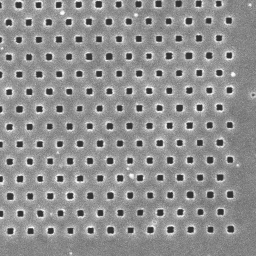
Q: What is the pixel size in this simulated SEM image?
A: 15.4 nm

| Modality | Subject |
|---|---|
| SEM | a regular array of holes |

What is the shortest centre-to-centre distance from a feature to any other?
19.6 pixels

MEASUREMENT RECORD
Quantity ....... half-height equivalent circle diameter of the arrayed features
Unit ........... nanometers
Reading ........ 107